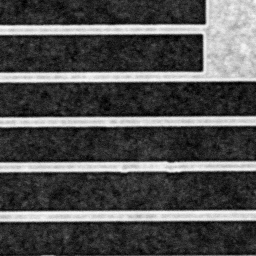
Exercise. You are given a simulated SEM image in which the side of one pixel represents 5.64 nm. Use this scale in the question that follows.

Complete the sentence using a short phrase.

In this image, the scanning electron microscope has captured parallel lines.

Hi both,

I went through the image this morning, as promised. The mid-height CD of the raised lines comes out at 0.0423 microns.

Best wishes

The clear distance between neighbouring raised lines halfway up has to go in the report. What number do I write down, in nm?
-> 209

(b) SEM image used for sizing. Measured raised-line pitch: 264 nanometres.